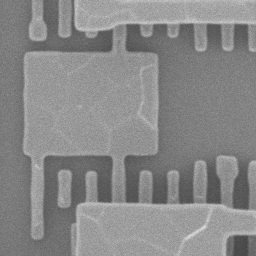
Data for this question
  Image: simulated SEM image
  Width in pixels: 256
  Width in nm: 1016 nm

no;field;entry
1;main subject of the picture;wiring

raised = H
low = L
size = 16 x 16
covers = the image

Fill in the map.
LLLLLHHHHHHHHHHH
LLLLLHHHLLLLLLLL
LLLLLLLLLLLLLLLL
LLLLLLLLLLLLLLLL
LLLLLLLLLLLLLLLL
LLLLLLLLLLLLLLLL
LLLLLLLLLLLLLLLL
LLLLLLLLLLLLLLLL
LLLLLLLLLLLLLLLL
LLLLLLLLLLLLLLLL
LLLLLLLLLLLLLLLL
LLLLLLLLLLLLLLLL
LLLLLLLLLLLLLLLL
LLLLLHHHHHHHHHHH
LLLLLHHHHHHHHHHH
LLLLLHHHHHHHHHLL